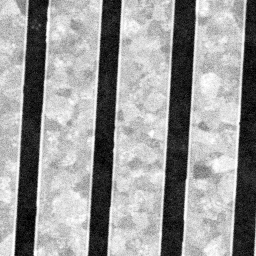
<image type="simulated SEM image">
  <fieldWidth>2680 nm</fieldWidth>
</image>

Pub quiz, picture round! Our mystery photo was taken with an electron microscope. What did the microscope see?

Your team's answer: one or a few lines or trenches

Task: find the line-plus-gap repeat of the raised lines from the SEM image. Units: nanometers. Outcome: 764